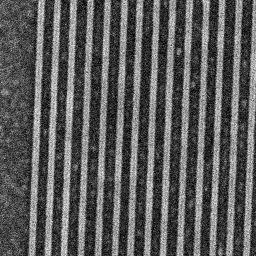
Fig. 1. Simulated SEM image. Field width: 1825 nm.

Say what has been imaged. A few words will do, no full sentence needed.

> parallel lines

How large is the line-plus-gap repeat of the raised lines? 118 nm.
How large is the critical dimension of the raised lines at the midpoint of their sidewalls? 4.99 pixels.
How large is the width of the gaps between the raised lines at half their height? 84.6 nanometres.